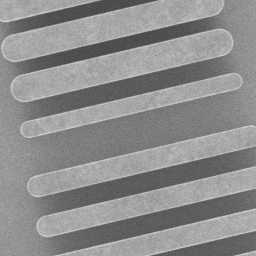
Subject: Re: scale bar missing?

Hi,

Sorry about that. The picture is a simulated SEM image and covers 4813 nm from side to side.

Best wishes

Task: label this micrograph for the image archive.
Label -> groups of lines, slits or small figures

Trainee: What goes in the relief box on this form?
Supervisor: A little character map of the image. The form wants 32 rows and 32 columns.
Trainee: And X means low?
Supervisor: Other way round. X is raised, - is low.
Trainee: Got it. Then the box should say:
XXXXXXXXXX--------XXXXXXXXXX----
XXXXXX--------XXXXXXXXXXXXX-----
XX-------XXXXXXXXXXXXXXX--------
-----XXXXXXXXXXXXXXX------------
-XXXXXXXXXXXXXXX-------XXXXXX---
XXXXXXXXXXXX-------XXXXXXXXXX---
XXXXXXX--------XXXXXXXXXXXXXX---
-XX--------XXXXXXXXXXXXXXX------
-------XXXXXXXXXXXXXX-----------
--XXXXXXXXXXXXXXX-----------XX--
-XXXXXXXXXXXX----------XXXXXXX--
-XXXXXXXX----------XXXXXXXXX----
--XX-----------XXXXXXXXX--------
----------XXXXXXXXX-------------
------XXXXXXXXX-----------------
---XXXXXXXX---------------------
---XXXX---------------------XXXX
------------------------XXXXXXXX
-------------------XXXXXXXXXXXX-
---------------XXXXXXXXXXXX-----
-----------XXXXXXXXXXXX---------
-------XXXXXXXXXXX-----------XXX
----XXXXXXXXXX-----------XXXXXXX
----XXXXXX----------XXXXXXXXXXXX
----X-----------XXXXXXXXXXXX----
------------XXXXXXXXXXX---------
--------XXXXXXXXXXX-----------XX
-----XXXXXXXXXX-----------XXXXXX
-----XXXXXX-----------XXXXXXXXXX
-----XX-----------XXXXXXXXXXX---
-------------XXXXXXXXXXXX-------
---------XXXXXXXXXXXX----------X